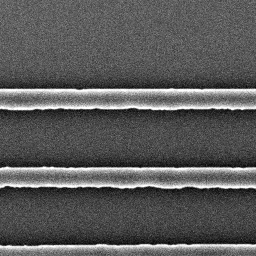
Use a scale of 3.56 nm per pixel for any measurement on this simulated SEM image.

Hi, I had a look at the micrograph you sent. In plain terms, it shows lines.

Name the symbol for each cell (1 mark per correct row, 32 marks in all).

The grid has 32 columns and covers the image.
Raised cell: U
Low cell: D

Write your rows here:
DDDDDDDDDDDDDDDDDDDDDDDDDDDDDDDD
DDDDDDDDDDDDDDDDDDDDDDDDDDDDDDDD
DDDDDDDDDDDDDDDDDDDDDDDDDDDDDDDD
DDDDDDDDDDDDDDDDDDDDDDDDDDDDDDDD
DDDDDDDDDDDDDDDDDDDDDDDDDDDDDDDD
DDDDDDDDDDDDDDDDDDDDDDDDDDDDDDDD
DDDDDDDDDDDDDDDDDDDDDDDDDDDDDDDD
DDDDDDDDDDDDDDDDDDDDDDDDDDDDDDDD
DDDDDDDDDDDDDDDDDDDDDDDDDDDDDDDD
DDDDDDDDDDDDDDDDDDDDDDDDDDDDDDDD
DDDDDDDDDDDDDDDDDDDDDDDDDDDDDDDD
UUUUUUUUUUUUUUUUUUUUUUUUUUUUUUUU
UUUUUUUUUUUUUUUUUUUUUUUUUUUUUUUU
UUUUUUUUUUUUUUUUDUUUUUUUUUUUUUUU
DDDDDDDDDDDDDDDDDDDDDDDDDDDDDDDD
DDDDDDDDDDDDDDDDDDDDDDDDDDDDDDDD
DDDDDDDDDDDDDDDDDDDDDDDDDDDDDDDD
DDDDDDDDDDDDDDDDDDDDDDDDDDDDDDDD
DDDDDDDDDDDDDDDDDDDDDDDDDDDDDDDD
DDDDDDDDDDDDDDDDDDDDDDDDDDDDDDDD
DDDDDDDDDDDDDDDDDDDDDDDDDDDDDDDD
UUUUUUUUUUUUUUUUUUUUUUUUUUUUUUUU
UUUUUUUUUUUUUUUUUUUUUUUUUUUUUUUU
DDDDDDDDDDDDDDDDDDDDDDDDDDDDDDDD
DDDDDDDDDDDDDDDDDDDDDDDDDDDDDDDD
DDDDDDDDDDDDDDDDDDDDDDDDDDDDDDDD
DDDDDDDDDDDDDDDDDDDDDDDDDDDDDDDD
DDDDDDDDDDDDDDDDDDDDDDDDDDDDDDDD
DDDDDDDDDDDDDDDDDDDDDDDDDDDDDDDD
DDDDDDDDDDDDDDDDDDDDDDDDDDDDDDDD
DDDDDDDDDDDDDDDDDDDDDDDDDDDDDDDD
UUUUUUUUUUUUUUUUUUUUUUUUUUUUUUUU